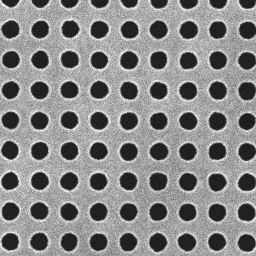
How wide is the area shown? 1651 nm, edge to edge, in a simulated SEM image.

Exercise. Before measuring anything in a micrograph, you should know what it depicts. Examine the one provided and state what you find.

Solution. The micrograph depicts a regular array of holes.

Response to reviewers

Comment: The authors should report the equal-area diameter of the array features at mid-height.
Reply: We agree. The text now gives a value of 18 px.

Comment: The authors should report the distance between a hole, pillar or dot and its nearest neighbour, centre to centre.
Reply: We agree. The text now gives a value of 0.189 micrometres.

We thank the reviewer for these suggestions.